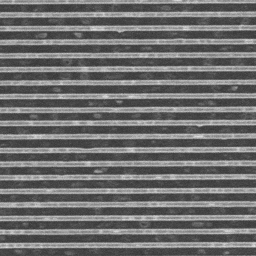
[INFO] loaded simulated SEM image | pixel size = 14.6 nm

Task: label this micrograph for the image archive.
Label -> parallel lines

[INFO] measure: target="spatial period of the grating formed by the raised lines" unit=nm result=198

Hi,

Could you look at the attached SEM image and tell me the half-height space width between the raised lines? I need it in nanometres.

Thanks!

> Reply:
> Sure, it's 128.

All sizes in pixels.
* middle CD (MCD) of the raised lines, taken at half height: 4.37